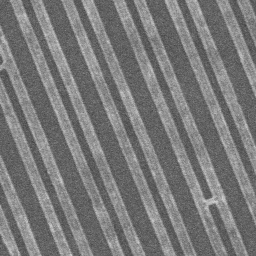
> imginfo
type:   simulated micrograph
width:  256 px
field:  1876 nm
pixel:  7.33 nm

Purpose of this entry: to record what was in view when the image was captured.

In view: parallel lines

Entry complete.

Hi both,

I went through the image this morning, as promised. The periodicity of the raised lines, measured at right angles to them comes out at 23.9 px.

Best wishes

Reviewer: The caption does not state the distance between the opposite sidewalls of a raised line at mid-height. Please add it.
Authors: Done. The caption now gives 9.03 px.